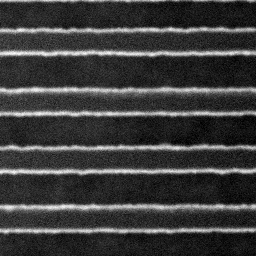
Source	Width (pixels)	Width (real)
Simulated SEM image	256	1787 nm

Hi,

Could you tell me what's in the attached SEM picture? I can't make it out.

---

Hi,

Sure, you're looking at lines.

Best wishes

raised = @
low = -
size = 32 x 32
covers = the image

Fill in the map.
--------------------------------
--------------------------------
--------------------------------
--------------------------------
@@@@@@@@@@@@@@@@@@@@@@@@@@@@@@@@
@@@@@@@@@@@@@@@@@@@@@@@@@@@@@@@@
@@@@@@@@@@@@@@@@@@@@@@@@@@@@@@@@
--------------------------------
--------------------------------
--------------------------------
--------------------------------
@@@@@@@@@@@@@@@@@@@@@@@@@@@@@@@@
@@@@@@@@@@@@@@@@@@@@@@@@@@@@@@@@
@@@@@@@@@@@@@@@@@@@@@@@@@@@@@@@@
--------------------------------
--------------------------------
--------------------------------
--------------------------------
@@-@@--@@@@-@@@@@@@@@@@@@@@@@@@@
@@@@@@@@@@@@@@@@@@@@@@@@@@@@@@@@
@@@@@@@@@@@@@@@@@@@@@@@@@@@@@@@@
@@@@@@@@@@@@@@@@@@@@@@@@@--@@-@@
--------------------------------
--------------------------------
--------------------------------
--------------------------------
@@@@@@@@@@@@@@@@@@@@@@@@@@@@@@@@
@@@@@@@@@@@@@@@@@@@@@@@@@@@@@@@@
@@@@@@@@@@@@@@@@@@@@@@@@@@@@@@@@
--------------------------------
--------------------------------
--------------------------------